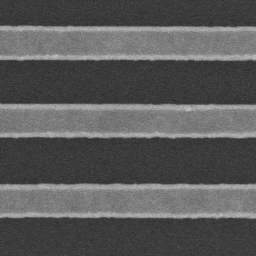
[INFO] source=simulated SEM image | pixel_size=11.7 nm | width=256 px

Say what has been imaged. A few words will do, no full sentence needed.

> lines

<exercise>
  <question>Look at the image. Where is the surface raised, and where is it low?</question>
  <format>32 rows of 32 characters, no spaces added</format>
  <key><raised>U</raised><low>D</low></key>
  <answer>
DDDDDDDDDDDDDDDDDDDDDDDDDDDDDDDD
DDDDDDDDDDDDDDDDDDDDDDDDDDDDDDDD
DDDDDDDDDDDDDDDDDDDDDDDDDDDDDDDD
UUUUUUUUUUUUUUUUUUUUUUUUUUUUUUUU
UUUUUUUUUUUUUUUUUUUUUUUUUUUUUUUU
UUUUUUUUUUUUUUUUUUUUUUUUUUUUUUUU
UUUUUUUUUUUUUUUUUUUUUUUUUUUUUUUU
DDUDDDDDDDDDDDDDDDDDDDDDDDDUUUUD
DDDDDDDDDDDDDDDDDDDDDDDDDDDDDDDD
DDDDDDDDDDDDDDDDDDDDDDDDDDDDDDDD
DDDDDDDDDDDDDDDDDDDDDDDDDDDDDDDD
DDDDDDDDDDDDDDDDDDDDDDDDDDDDDDDD
DDDDDDDDDDDDDDDDDDDDDDDDDDDDDDDD
UUUUUUUUUUUUUUUUUUUUUUUUUUUUUUUU
UUUUUUUUUUUUUUUUUUUUUUUUUUUUUUUU
UUUUUUUUUUUUUUUUUUUUUUUUUUUUUUUU
UUUUUUUUUUUUUUUUUUUUUUUUUUUUUUUU
DDDDDDDDDDDDDDDDDDDDDDDDDDDDDDDD
DDDDDDDDDDDDDDDDDDDDDDDDDDDDDDDD
DDDDDDDDDDDDDDDDDDDDDDDDDDDDDDDD
DDDDDDDDDDDDDDDDDDDDDDDDDDDDDDDD
DDDDDDDDDDDDDDDDDDDDDDDDDDDDDDDD
DDDDDDDDDDDDDDDDDDDDDDDDDDDDDDDD
UUUUUUUUUUUUUUUUUUUUUUUUUUUUUUUU
UUUUUUUUUUUUUUUUUUUUUUUUUUUUUUUU
UUUUUUUUUUUUUUUUUUUUUUUUUUUUUUUU
UUUUUUUUUUUUUUUUUUUUUUUUUUUUUUUU
DDDDDDDDDDDDDDDDDDDDDDDDDDDDDDDD
DDDDDDDDDDDDDDDDDDDDDDDDDDDDDDDD
DDDDDDDDDDDDDDDDDDDDDDDDDDDDDDDD
DDDDDDDDDDDDDDDDDDDDDDDDDDDDDDDD
DDDDDDDDDDDDDDDDDDDDDDDDDDDDDDDD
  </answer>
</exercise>